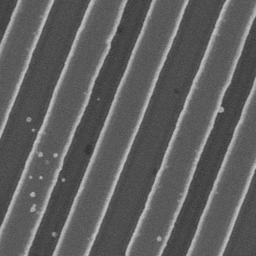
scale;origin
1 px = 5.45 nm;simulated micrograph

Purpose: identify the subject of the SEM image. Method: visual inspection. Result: lines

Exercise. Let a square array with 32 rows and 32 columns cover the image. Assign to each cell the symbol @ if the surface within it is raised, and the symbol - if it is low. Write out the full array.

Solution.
--@@@@@----@@@@@---@@@@-----@@@@
--@@@@-----@@@@----@@@@-----@@@@
-@@@@@----@@@@@---@@@@@----@@@@@
-@@@@-----@@@@@---@@@@-----@@@@-
-@@@@-----@@@@---@@@@@----@@@@@-
@@@@@----@@@@@---@@@@-----@@@@--
@@@@-----@@@@@---@@@@-----@@@@--
@@@@----@@@@@---@@@@@----@@@@@--
@@@-----@@@@@---@@@@-----@@@@---
@@@-----@@@@---@@@@@-----@@@@---
@@@----@@@@@---@@@@-----@@@@@---
@@-----@@@@----@@@@-----@@@@---@
@@----@@@@@---@@@@@----@@@@@---@
@-----@@@@@---@@@@-----@@@@---@@
@-----@@@@----@@@@-----@@@@---@@
@----@@@@@---@@@@@----@@@@@---@@
-----@@@@----@@@@-----@@@@---@@@
-----@@@@---@@@@@----@@@@@---@@@
----@@@@@---@@@@-----@@@@----@@@
----@@@@----@@@@-----@@@@---@@@@
---@@@@@---@@@@@----@@@@@---@@@@
---@@@@----@@@@-----@@@@---@@@@@
---@@@@---@@@@@----@@@@@---@@@@-
--@@@@@---@@@@-----@@@@@---@@@@-
--@@@@----@@@@-----@@@@---@@@@@-
-@@@@@---@@@@@----@@@@@---@@@@--
-@@@@----@@@@-----@@@@---@@@@@--
-@@@@---@@@@@----@@@@@---@@@@---
@@@@@---@@@@-----@@@@@---@@@@---
@@@@----@@@@-----@@@@---@@@@@---
@@@@---@@@@@----@@@@@---@@@@----
@@@----@@@@-----@@@@----@@@@----